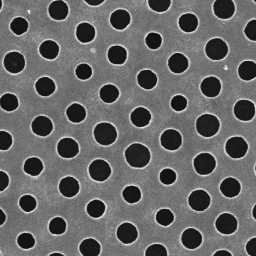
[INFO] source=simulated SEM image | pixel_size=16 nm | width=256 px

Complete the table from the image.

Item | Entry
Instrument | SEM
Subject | a regular array of holes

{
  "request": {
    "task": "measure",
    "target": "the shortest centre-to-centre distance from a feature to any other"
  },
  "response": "570 nm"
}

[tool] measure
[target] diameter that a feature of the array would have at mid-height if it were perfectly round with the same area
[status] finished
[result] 322 nm